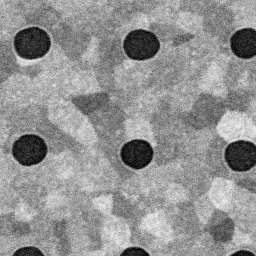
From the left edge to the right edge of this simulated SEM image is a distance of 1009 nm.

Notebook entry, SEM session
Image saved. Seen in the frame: holes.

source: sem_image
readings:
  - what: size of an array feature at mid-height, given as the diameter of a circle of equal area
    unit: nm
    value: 137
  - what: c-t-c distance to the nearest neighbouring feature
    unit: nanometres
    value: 422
